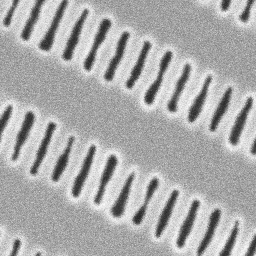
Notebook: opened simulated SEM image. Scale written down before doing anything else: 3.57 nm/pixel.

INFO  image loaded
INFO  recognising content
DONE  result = a regular array of holes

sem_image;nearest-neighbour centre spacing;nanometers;83.6